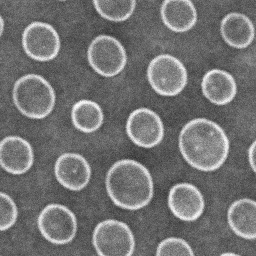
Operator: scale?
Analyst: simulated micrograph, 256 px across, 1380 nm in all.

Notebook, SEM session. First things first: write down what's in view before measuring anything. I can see a regular array of raised bodies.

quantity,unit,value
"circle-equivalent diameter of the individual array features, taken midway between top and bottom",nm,191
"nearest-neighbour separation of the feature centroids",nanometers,298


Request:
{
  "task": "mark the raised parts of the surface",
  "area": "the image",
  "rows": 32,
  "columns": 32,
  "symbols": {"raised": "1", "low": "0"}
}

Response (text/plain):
00000000000011111000011100000000
00000000000011110000111100000000
00000000000000100000011100001110
00001100000000000000011100001111
00011110000000000000000000001111
00011110000111100000000000000110
00011110000111100000000000000000
00000000000111110001110000000000
00000000000011100001111000000000
00001000000000000001111000111000
00111100000000000001111001111000
00111110000000000000110001111000
00111110000000000000000000111000
00111100011100000000000000000000
00001000011110001111000000000000
00000000011100001111000011100000
00000000000000001111000111110000
01100000000000000111000111110000
11110000000000000000000111110000
11110000110000000000000111110001
11110001111000011000000011110001
01100001111000111100000000000000
00000001111001111110000000000000
00000000010001111110001100000000
10000000000000111110011110000000
11000000000000011100011110000111
11000111100000000000001110000111
11000111100000000000000000000111
10000111100011110000000000000111
00000011100011110000000000000011
00000000000011111000111000000000
00000000000011110000111100000000